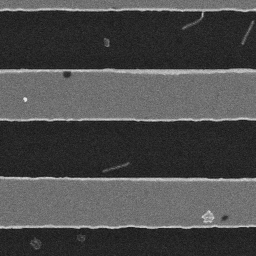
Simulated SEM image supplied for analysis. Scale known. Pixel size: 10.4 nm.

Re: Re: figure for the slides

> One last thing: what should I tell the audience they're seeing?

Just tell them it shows lines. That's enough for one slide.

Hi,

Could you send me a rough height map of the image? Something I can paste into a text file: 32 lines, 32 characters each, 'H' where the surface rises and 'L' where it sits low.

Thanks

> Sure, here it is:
HHHHHHHHHHHHHHHHHHHHHHHHHHHHHHHH
LLLLLLLLLLLLLLLLLLLLLLLLLLLLLLLL
LLLLLLLLLLLLLLLLLLLLLLLLLLLLLLLL
LLLLLLLLLLLLLLLLLLLLLLLLLLLLLLLL
LLLLLLLLLLLLLLLLLLLLLLLLLLLLLLLL
LLLLLLLLLLLLLLLLLLLLLLLLLLLLLLLL
LLLLLLLLLLLLLLLLLLLLLLLLLLLLLLLL
LLLLLLLLLLLLLLLLLLLLLLLLLLLLLLLL
LLLLLLLLLLLLLLLLLLLLLLLLLLLLLLLL
HHHHHHHHHHHHHHHHHHHHHHHHHHHHHHHH
HHHHHHHHHHHHHHHHHHHHHHHHHHHHHHHH
HHHHHHHHHHHHHHHHHHHHHHHHHHHHHHHH
HHHHHHHHHHHHHHHHHHHHHHHHHHHHHHHH
HHHHHHHHHHHHHHHHHHHHHHHHHHHHHHHH
HHHHHHHHHHHHHHHHHHHHHHHHHHHHHHHH
LLLLLLLLLLLLLLLLLLLLLLLLLLLLLLLL
LLLLLLLLLLLLLLLLLLLLLLLLLLLLLLLL
LLLLLLLLLLLLLLLLLLLLLLLLLLLLLLLL
LLLLLLLLLLLLLLLLLLLLLLLLLLLLLLLL
LLLLLLLLLLLLLLLLLLLLLLLLLLLLLLLL
LLLLLLLLLLLLLLLLLLLLLLLLLLLLLLLL
LLLLLLLLLLLLLLLLLLLLLLLLLLLLLLLL
HHHHHHHHHHHHHHHHHHHHHHHHHHHHHHHH
HHHHHHHHHHHHHHHHHHHHHHHHHHHHHHHH
HHHHHHHHHHHHHHHHHHHHHHHHHHHHHHHH
HHHHHHHHHHHHHHHHHHHHHHHHHHHHHHHH
HHHHHHHHHHHHHHHHHHHHHHHHHHHHHHHH
HHHHHHHHHHHHHHHHHHHHHHHHHHHHHHHH
LLLLLLLLLLLLLHHLLLHHLLLLLLLLLLLL
LLLLLLLLLLLLLLLLLLLLLLLLLLLLLLLL
LLLLLLLLLLLLLLLLLLLLLLLLLLLLLLLL
LLLLLLLLLLLLLLLLLLLLLLLLLLLLLLLL